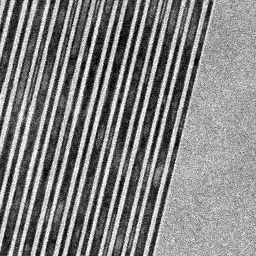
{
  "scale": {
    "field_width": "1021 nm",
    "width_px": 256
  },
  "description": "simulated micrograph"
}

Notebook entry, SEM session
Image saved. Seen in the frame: parallel lines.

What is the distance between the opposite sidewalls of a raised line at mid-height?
0.0126 micrometres